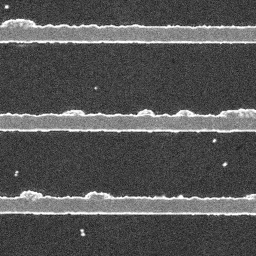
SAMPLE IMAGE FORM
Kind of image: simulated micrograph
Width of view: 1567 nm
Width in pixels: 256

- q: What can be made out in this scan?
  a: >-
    lines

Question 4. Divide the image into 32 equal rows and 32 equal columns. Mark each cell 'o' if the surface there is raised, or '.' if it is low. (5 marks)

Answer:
................................
................................
.oo.............................
oooooooooooooooooooooooooooooooo
oooooooooooooooooooooooooooooooo
................................
................................
................................
................................
................................
................................
................................
................................
................................
oooooooooooooooooooooooooooooooo
oooooooooooooooooooooooooooooooo
................................
................................
................................
................................
................................
................................
................................
................................
...oo......ooo.................o
oooooooooooooooooooooooooooooooo
oooooooooooooooooooooooooooooooo
................................
................................
................................
................................
................................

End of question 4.